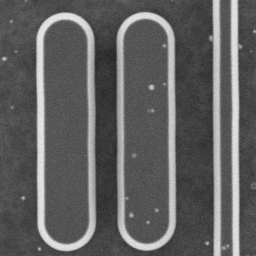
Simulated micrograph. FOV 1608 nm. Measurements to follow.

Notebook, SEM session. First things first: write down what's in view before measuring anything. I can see groups of lines, slits or small figures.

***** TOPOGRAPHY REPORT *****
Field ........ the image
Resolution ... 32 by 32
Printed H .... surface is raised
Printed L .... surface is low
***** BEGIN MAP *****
LLLLLLLLLLLLLLLLLLLLLLLLLLLHHLLL
LLLLLLLLLLLLLLLLLLLLLLLLLLLHHLLL
LLLLLLHHHHLLLLLLHHHHLLLLLLLHHLLL
LLLLLHHHHHHLLLLHHHHHHLLLLLLHHLLL
LLLLLHHHHHHLLLLHHHHHHLLLLLLHHLLL
LLLLLHHHHHHLLLLHHHHHHLLLLLLHHLLL
LLLLLHHHHHHLLLLHHHHHHLLLLLLHHLLL
LLLLLHHHHHHLLLLHHHHHHLLLLLLHHLLL
LLLLLHHHHHHLLLLHHHHHHLLLLLLHHLLL
LLLLLHHHHHHLLLLHHHHHHLLLLLLHHLLL
LLLLLHHHHHHLLLLHHHHHHLLLLLLHHLLL
LLLLLHHHHHHLLLLHHHHHHLLLLLLHHLLL
LLLLLHHHHHHLLLLHHHHHHLLLLLLHHLLL
LLLLLHHHHHHLLLLHHHHHHLLLLLLHHLLL
LLLLLHHHHHHLLLLHHHHHHLLLLLLHHLLL
LLLLLHHHHHHLLLLHHHHHHLLLLLLHHLLL
LLLLLHHHHHHLLLLHHHHHHLLLLLLHHLLL
LLLLLHHHHHHLLLLHHHHHHLLLLLLHHLLL
LLLLLHHHHHHLLLLHHHHHHLLLLLLHHLLL
LLLLLHHHHHHLLLLHHHHHHLLLLLLHHLLL
LLLLLHHHHHHLLLLHHHHHHLLLLLLHHLLL
LLLLLHHHHHHLLLLHHHHHHLLLLLLHHLLL
LLLLLHHHHHHLLLLHHHHHHHLLLLLHHLLL
LLLLLHHHHHHLLLLHHHHHHHLLLLLHHLLL
LLLLLHHHHHHLLLLHHHHHHHLLLLLHHLLL
LLLLLHHHHHHLLLLHHHHHHLLLLLLHHLLL
LLLLLHHHHHHLLLLHHHHHHHLLLLLHHLLL
LLLLLHHHHHHLLLLHHHHHHHLLLLLHHLLL
LLLLLHHHHHHLLLLHHHHHHLLLLLLHHLLL
LLLLLLHHHHHLLLLLHHHHHLLLLLLHHLLL
LLLLLLLHHHLLLLLLLHHHLLLLLLLHHLLL
LLLLLLLLLLLLLLLLLLLLLLLLLLLHHLLL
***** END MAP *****